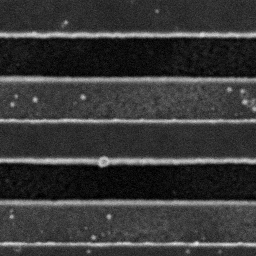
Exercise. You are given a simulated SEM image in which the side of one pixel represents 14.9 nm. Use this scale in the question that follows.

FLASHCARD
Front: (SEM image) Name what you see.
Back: lines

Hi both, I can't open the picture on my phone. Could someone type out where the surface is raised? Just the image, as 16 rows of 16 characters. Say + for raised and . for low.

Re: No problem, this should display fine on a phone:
++++++++++++++++
++++++++++++++++
................
................
................
++++++++++++++++
++++++++++++++++
++++++++++++++++
++++++++++++++++
++++++++++++++++
................
................
................
++++++++++++++++
++++++++++++++++
++++++++++++++++